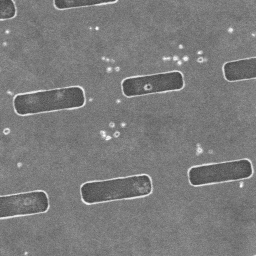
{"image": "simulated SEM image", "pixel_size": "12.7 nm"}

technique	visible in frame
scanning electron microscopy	holes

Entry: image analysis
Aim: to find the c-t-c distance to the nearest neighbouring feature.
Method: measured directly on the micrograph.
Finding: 105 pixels